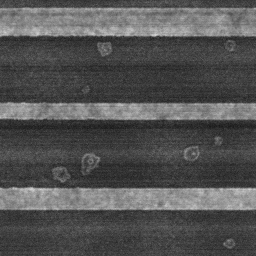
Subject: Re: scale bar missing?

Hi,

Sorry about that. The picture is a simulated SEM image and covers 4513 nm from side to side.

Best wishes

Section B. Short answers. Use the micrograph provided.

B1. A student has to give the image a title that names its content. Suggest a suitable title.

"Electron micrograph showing lines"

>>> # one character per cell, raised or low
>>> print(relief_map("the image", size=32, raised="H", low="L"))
LLLLLLLLLLLLLLLLLLLLLLLLLLLLLLLL
HHHHHHHHHHHHHHHHHHHHHHHHHHHHHHHH
HHHHHHHHHHHHHHHHHHHHHHHHHHHHHHHH
HHHHHHHHHHHHHHHHHHHHHHHHHHHHHHHH
LLLLLLLLLLLLLLLLLLLLLLLLLLLLLLLL
LLLLLLLLLLLLLLLLLLLLLLLLLLLLLLLL
LLLLLLLLLLLLLLLLLLLLLLLLLLLLLLLL
LLLLLLLLLLLLLLLLLLLLLLLLLLLLLLLL
LLLLLLLLLLLLLLLLLLLLLLLLLLLLLLLL
LLLLLLLLLLLLLLLLLLLLLLLLLLLLLLLL
LLLLLLLLLLLLLLLLLLLLLLLLLLLLLLLL
LLLLLLLLLLLLLLLLLLLLLLLLLLLLLLLL
LLLLLLLLLLLLLLLLLLLLLLLLLLLLLLLL
HHHHHHHHHHHHHHHHHHHHHHHHHHHHHHHH
HHHHHHHHHHHHHHHHHHHHHHHHHHHHHHHH
LLLLLLLLLLLLLLLLLLLLLLLLLLLLLLLL
LLLLLLLLLLLLLLLLLLLLLLLLLLLLLLLL
LLLLLLLLLLLLLLLLLLLLLLLLLLLLLLLL
LLLLLLLLLLLLLLLLLLLLLLLLLLLLLLLL
LLLLLLLLLLLHLLLLLLLLLLLHHLLLLLLL
LLLLLLLLLLLHLLLLLLLLLLLLLLLLLLLL
LLLLLLLHLLLLLLLLLLLLLLLLLLLLLLLL
LLLLLLLLLLLLLLLLLLLLLLLLLLLLLLLL
LLLLLLLLLLLLLLLLLLLLLLLLLLLLLLLL
HHHHHHHHHHHHHHHHHHHHHHHHHHHHHHHH
HHHHHHHHHHHHHHHHHHHHHHHHHHHHHHHH
LLLLLLLLLLLLLLLLLLLLLLLLLLLLLLLL
LLLLLLLLLLLLLLLLLLLLLLLLLLLLLLLL
LLLLLLLLLLLLLLLLLLLLLLLLLLLLLLLL
LLLLLLLLLLLLLLLLLLLLLLLLLLLLLLLL
LLLLLLLLLLLLLLLLLLLLLLLLLLLLLLLL
LLLLLLLLLLLLLLLLLLLLLLLLLLLLLLLL